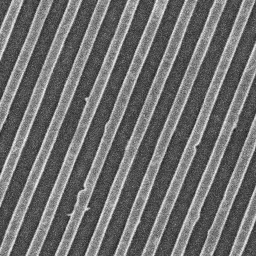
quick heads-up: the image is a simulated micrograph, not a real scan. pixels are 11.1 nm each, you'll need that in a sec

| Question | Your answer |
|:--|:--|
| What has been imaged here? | parallel lines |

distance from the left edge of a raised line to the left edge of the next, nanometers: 298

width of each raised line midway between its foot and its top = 113 nanometers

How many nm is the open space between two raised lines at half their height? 188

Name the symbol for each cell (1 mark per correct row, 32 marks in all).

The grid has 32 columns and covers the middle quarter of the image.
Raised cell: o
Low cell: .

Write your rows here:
..ooo.....oo.....oo.....ooo....o
..ooo....ooo....ooo.....ooo....o
..oo.....ooo....ooo....ooo....oo
.ooo....ooo....ooo.....ooo....oo
.oo.....ooo....ooo....ooo.....oo
ooo....ooo.....oo.....ooo....ooo
ooo....ooo....ooo....ooo.....ooo
oo.....ooo....ooo....ooo....ooo.
oo....ooo....ooo.....ooo....ooo.
o.....ooo....ooo....ooo.....oo..
o....ooo.....ooo....ooo....ooo..
o....ooo....ooo....ooo.....ooo..
.....oo.....ooo....ooo....ooo...
....ooo.....oo.....ooo....ooo...
....ooo....ooo....ooo.....oo....
...ooo....ooo.....ooo....ooo....
...ooo....ooo....ooo.....oo.....
...oo.....ooo....ooo....ooo.....
..ooo.....oo.....ooo....ooo....o
..ooo....ooo....ooo.....oo.....o
..oo.....oo.....ooo....ooo.....o
.ooo.....oo....ooo.....oo.....oo
.oo.....ooo....ooo....ooo.....oo
ooo.....oo.....oo.....ooo....ooo
ooo....ooo.....oo.....oo.....ooo
oo.....ooo....ooo....ooo.....oo.
oo.....oo.....oo.....oo.....ooo.
o.....ooo....ooo....ooo.....oo..
o.....oo.....oo.....ooo....ooo..
o....ooo.....oo.....oo.....ooo..
.....ooo....ooo....ooo....ooo...
.....oo.....oo.....oo.....ooo...